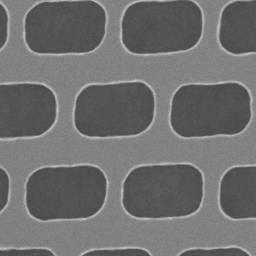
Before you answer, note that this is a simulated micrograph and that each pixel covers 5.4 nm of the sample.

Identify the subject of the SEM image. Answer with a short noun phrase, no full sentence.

holes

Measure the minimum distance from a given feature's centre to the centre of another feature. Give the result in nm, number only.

511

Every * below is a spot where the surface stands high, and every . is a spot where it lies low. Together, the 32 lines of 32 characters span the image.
*****.......*****.......*****...
.***.........***.........***....
.**..........**..........***....
.**..........**..........**.....
.**..........**..........**.....
.**.........***..........***....
****.......*****......*******...
********************************
********************************
********************************
**...*********....**********..**
......****.........***.........*
.......**..........***.........*
.......**..........**..........*
.......**..........**..........*
.......**..........**..........*
......****........****........**
********************************
********************************
********************************
********************************
.***.........***.........***....
.**..........***.........***....
.**..........**..........**.....
.**..........**..........**.....
.**..........**..........**.....
****........****........****....
*****.**************************
********************************
********************************
********************************
......*****.......*****........*